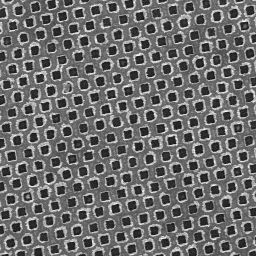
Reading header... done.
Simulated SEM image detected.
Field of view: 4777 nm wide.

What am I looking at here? a regular array of holes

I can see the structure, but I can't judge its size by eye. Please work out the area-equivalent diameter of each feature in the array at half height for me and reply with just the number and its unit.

176 nanometres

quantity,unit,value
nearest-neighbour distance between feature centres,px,16.3